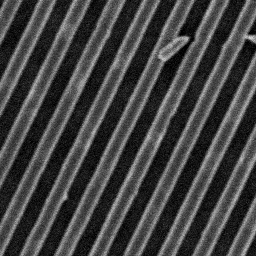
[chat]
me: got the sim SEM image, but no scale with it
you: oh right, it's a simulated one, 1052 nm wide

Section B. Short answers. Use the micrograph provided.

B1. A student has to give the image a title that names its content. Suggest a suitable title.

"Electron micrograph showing parallel lines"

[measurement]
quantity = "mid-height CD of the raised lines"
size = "57 nm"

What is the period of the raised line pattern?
128 nanometers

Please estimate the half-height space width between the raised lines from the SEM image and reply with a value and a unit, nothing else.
17.3 px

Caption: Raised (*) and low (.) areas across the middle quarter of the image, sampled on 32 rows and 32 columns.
...****.....****.....***.....***
...****....****.....****.....***
...***.....****.....***.....****
..****.....***.....****.....****
..***.....****.....****....****.
.****....****.....****.....****.
.***.....****.....****....****..
****.....***.....****.....****..
***.....****.....****....****...
***.....***.....****.....****...
**.....****.....****.....***....
**.....****....****.....****....
*.....****.....****.....***.....
*.....****....****.....***......
.....****.....****.....***.....*
.....****....****.....****.....*
....****.....****.....***.....**
....****.....***.....****.....**
...****.....****.....***.....***
...****.....***.....****.....***
..****.....****.....***.....****
..****.....***.....****.....****
.****.....****.....****....****.
.****.....****....****.....****.
****.....****.....***.....****..
****.....****....****.....****..
***.....****.....****....****...
***.....****....****.....****...
**.....****.....****....****....
**.....****....****.....****....
*.....****.....****....****.....
*.....***.....****.....****.....